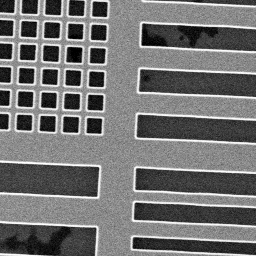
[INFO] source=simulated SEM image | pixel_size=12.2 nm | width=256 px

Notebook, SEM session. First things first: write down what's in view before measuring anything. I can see groups of lines, slits or small figures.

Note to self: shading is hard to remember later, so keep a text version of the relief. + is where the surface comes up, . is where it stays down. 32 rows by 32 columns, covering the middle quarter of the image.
++++++++++++++++++++++++++++++++
....+++++++++++++++...........++
.....+....+++++++++.............
.....+....+++++++++.............
....++....+++++++++.............
+...++....+++++++++.............
+++++++++++++++++++.............
....++++++++++++++++++++........
....++....++++++++++++++++++++++
....++....++++++++++++++++++++++
....++....++++++++++++++++++++++
+...++....++++++++++++++++++++++
+++++++++++++++++++....+++++++++
....++...+++++++++..............
....++....++++++++..............
....+.....++++++++..............
....+.....++++++++..............
+++++++..+++++++++..............
++++++++++++++++++..............
++++++++++++++++++++++++++++++++
++++++++++++++++++++++++++++++++
++++++++++++++++++++++++++++++++
++++++++++++++++++++++++++++++++
++++++++++++++++++++++++++++++++
++++++++++++++++++++++++++++++++
.........+++++++++++++++++++++++
.........+++++++++............++
.........+++++++++..............
.........+++++++++..............
.........+++++++++..............
.........++++++++...............
.........+++++++++..............